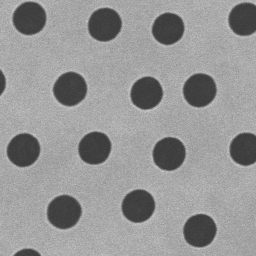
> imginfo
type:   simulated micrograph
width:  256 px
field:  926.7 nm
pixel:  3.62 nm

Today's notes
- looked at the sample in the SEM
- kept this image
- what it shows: a regular array of holes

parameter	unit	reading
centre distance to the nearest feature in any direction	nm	231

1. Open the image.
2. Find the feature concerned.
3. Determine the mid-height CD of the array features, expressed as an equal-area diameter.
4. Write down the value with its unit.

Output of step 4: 122 nm